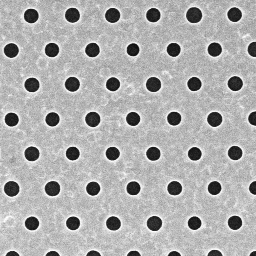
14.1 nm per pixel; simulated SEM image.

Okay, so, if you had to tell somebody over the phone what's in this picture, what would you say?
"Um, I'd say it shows a regular array of holes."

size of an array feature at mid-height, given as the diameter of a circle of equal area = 210 nanometers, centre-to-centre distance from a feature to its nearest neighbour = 0.563 microns